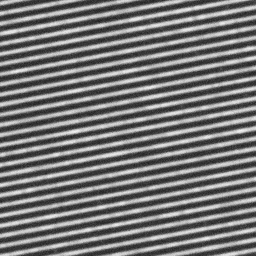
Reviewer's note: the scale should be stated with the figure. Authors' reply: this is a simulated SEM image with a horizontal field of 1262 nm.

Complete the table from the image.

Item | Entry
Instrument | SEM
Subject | parallel lines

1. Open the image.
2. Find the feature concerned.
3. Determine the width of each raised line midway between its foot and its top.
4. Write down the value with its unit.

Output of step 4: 0.0122 micrometres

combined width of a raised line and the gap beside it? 49 nanometers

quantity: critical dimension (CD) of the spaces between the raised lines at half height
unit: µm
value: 0.0376